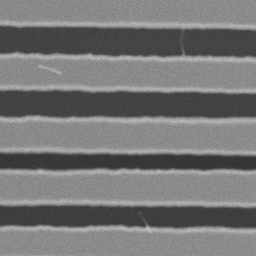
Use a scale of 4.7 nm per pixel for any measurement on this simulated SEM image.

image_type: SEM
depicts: lines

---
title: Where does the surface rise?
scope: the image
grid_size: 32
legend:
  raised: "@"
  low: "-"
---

@@@@@@@@@@@@@@@@@@@@@@@@@@@@@@@@
@@@@@@@@@@@@@@@@@@@@@@@@@@@@@@@@
@@@@@@@@@@@@@@@@@@@@@@@@@@@@@@@@
-------------------@--@@@@@@@@@@
--------------------------------
--------------------------------
--------------------------------
@@@@@@@@@@@@@@@@@@@@@@@@@@@@@@@@
@@@@@@@@@@@@@@@@@@@@@@@@@@@@@@@@
@@@@@@@@@@@@@@@@@@@@@@@@@@@@@@@@
@@@@@@@@@@@@@@@@@@@@@@@@@@@@@@@@
--------------------@------@@@@@
--------------------------------
--------------------------------
----@---------------------------
@@@@@@@@@@@@@@@@@@@@@@@@@@@@@@@@
@@@@@@@@@@@@@@@@@@@@@@@@@@@@@@@@
@@@@@@@@@@@@@@@@@@@@@@@@@@@@@@@@
@@@@@@@@@@@@@@@@@@@@@@@@@@@@@@@@
--------------------------------
--------------------------------
@@@@@@@@@@@@@@@@@@@@@@@@@@@@@@@@
@@@@@@@@@@@@@@@@@@@@@@@@@@@@@@@@
@@@@@@@@@@@@@@@@@@@@@@@@@@@@@@@@
@@@@@@@@@@@@@@@@@@@@@@@@@@@@@@@@
@@@@@@@@@@@@@@@@@@@@@@@@@@@@@@@@
--------------------------------
--------------------------------
@@@@@@@@@@@@@@@@@@@@@--@@@@@@---
@@@@@@@@@@@@@@@@@@@@@@@@@@@@@@@@
@@@@@@@@@@@@@@@@@@@@@@@@@@@@@@@@
@@@@@@@@@@@@@@@@@@@@@@@@@@@@@@@@